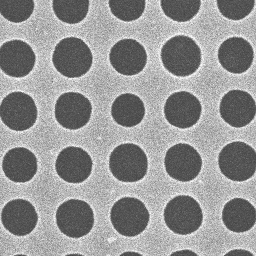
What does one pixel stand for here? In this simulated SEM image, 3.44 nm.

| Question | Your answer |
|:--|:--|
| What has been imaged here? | a regular array of holes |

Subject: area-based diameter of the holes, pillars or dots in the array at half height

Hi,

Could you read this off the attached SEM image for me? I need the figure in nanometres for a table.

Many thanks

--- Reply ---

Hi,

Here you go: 131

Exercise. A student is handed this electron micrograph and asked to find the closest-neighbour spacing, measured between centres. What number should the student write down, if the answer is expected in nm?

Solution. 182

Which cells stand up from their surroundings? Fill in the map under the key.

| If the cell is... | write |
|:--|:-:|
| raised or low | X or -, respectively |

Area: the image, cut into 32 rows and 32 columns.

----XXX----XXX----XX-----XX-----
----XXX----XXX----XX-----XXX---X
X--XXXXX--XXXXX--XXXXX--XXXXX-XX
XXXXXXXXXXXXXXXXXXXXXXXXXXXXXXXX
XXXXXXXXXXXXXXXXXXXXXX-XXXXXXXXX
---XXXX----XXX----XXX----XXX---X
----XXX----XXX----XX-----XX-----
----XXX-----XX----XX-----XX-----
----XXX----XXX----XXX----XXX---X
X--XXXXX--XXXXXXXXXXXX-XXXXXXXXX
XXXXXXXXXXXXXXXXXXXXXXXXXXXXXXXX
XX-XXXXXXXXXXXXXXXXXXX--XXXXX--X
----XXX----XXX----XXX----XXX----
-----XX----XXX----XX-----XX-----
-----XX----XXX----XXX----XXX----
X---XXX----XXXX--XXXX---XXXXX--X
XXXXXXXXXXXXXXXXXXXXXXXXXXXXXXXX
XXXXXXXXXXXXXXXXXXXXXXXXXXXXXXXX
XX-XXXXX--XXXX----XXX---XXXX----
X---XXX----XXX----XXX----XX-----
-----XX-----XX----XXX----XX-----
-----XX----XXX----XXX----XXX----
X---XXXX---XXXX---XXXX--XXXXX--X
XXXXXXXXXXXXXXXXXXXXXXXXXXXXXXXX
XXXXXXXXXXXXXXXXXXXXXX--XXXXXXXX
X---XXXX---XXX----XXX----XXX---X
-----XX-----XX-----X-----XXX----
-----XX-----XX-----X-----XXX----
X---XXX-----XX----XXX----XXX---X
XX-XXXXX--XXXXXX-XXXXXXXXXXXXXXX
XXXXXXXXXXXXXXXXXXXXXXXXXXXXXXXX
XXXXXXXXXXXXXXXX-XXXXX--XXXXX--X